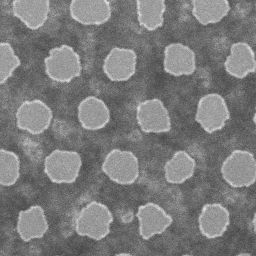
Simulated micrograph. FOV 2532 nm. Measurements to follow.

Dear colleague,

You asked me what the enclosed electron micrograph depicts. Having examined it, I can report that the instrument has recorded a regular array of raised bodies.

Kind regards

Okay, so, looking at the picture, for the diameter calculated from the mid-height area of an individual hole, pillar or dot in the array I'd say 323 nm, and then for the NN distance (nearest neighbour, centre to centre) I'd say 574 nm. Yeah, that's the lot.